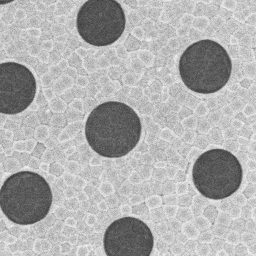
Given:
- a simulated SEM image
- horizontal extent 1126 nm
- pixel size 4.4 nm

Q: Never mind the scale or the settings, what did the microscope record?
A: holes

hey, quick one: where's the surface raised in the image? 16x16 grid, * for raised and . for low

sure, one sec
*****...********
*****...********
*****..*********
***********...**
..*********...**
..**********..**
..****..********
*****....*******
*****....*******
******..*****.**
************...*
...*********...*
...*************
...*************
*******..*******
*******...******